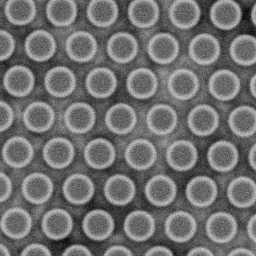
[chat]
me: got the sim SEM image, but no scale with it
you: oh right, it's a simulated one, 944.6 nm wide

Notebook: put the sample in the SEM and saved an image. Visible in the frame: an array of small figures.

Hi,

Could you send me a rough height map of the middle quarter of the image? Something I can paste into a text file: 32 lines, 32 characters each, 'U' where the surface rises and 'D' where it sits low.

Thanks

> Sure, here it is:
DDDDDDDDDDDDDDDDDDDDDDDDDDDDDDDD
UDDDDDDDUUUDDDDDDDUUUDDDDDDDDUUD
UUDDDDUUUUUUDDDDDUUUUUDDDDDUUUUU
UUUDDDUUUUUUUDDDUUUUUUUDDDDUUUUU
UUUDDDUUUUUUUDDDUUUUUUUDDDUUUUUU
UUUDDDUUUUUUUDDDUUUUUUUDDDUUUUUU
UUDDDDUUUUUUUDDDUUUUUUUDDDUUUUUU
UDDDDDDUUUUUDDDDDUUUUUDDDDDUUUUU
DDDDDDDDDDDDDDDDDDDUDDDDDDDDUUUD
DDDDDDDDDDDDDDDDDDDDDDDDDDDDDDDD
DDUUUUDDDDDDDUUUDDDDDDDUUUDDDDDD
DUUUUUUDDDDUUUUUUDDDDDUUUUUDDDDD
UUUUUUUUDDDUUUUUUUDDDUUUUUUUDDDU
UUUUUUUUDDDUUUUUUUDDDUUUUUUUDDDU
UUUUUUUUDDDUUUUUUUDDDUUUUUUUDDDU
DUUUUUUDDDDUUUUUUDDDDUUUUUUUDDDU
DDUUUUDDDDDDUUUUUDDDDDUUUUUDDDDD
DDDDDDDDDDDDDDDDDDDDDDDDUDDDDDDD
DDDDDDDDDDDDDDDDDDDDDDDDDDDDDDDD
UDDDDDDUUUUDDDDDDUUUUDDDDDDDUUUD
UUDDDDUUUUUUDDDDUUUUUUDDDDDUUUUU
UUDDDUUUUUUUDDDDUUUUUUUDDDUUUUUU
UUDDDUUUUUUUUDDUUUUUUUUDDDUUUUUU
UUDDDUUUUUUUUDDUUUUUUUUDDDUUUUUU
UUDDDDUUUUUUDDDDUUUUUUDDDDUUUUUU
DDDDDDDUUUUDDDDDDUUUUUDDDDDUUUUU
DDDDDDDDDDDDDDDDDDDDDDDDDDDDUUDD
DDDDDDDDDDDDDDDDDDDDDDDDDDDDDDDD
DUUUUUDDDDDDUUUUDDDDDDUUUUDDDDDD
UUUUUUUDDDDUUUUUUDDDDUUUUUUDDDDU
UUUUUUUDDDUUUUUUUUDDDUUUUUUUDDDU
UUUUUUUDDDUUUUUUUUDDUUUUUUUUDDDU